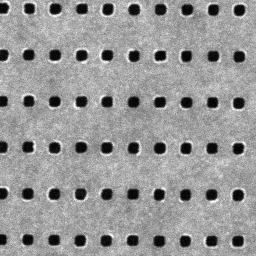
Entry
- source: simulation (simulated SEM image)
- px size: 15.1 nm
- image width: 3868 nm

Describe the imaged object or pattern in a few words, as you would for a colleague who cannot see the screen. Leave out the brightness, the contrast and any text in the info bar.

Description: a regular array of holes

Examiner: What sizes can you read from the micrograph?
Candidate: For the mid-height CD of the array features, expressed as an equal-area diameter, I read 194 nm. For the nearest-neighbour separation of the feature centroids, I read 394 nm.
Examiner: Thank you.